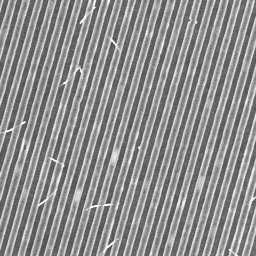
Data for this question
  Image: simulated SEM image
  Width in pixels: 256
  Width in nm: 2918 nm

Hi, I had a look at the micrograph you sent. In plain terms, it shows parallel lines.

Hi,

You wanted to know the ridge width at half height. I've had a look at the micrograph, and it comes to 78.2 nm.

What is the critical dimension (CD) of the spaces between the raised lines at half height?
61.7 nm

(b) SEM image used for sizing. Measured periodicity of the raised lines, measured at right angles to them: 145 nm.